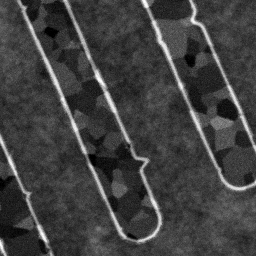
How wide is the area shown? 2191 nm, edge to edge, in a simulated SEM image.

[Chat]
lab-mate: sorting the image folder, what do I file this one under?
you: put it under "one or a few lines or trenches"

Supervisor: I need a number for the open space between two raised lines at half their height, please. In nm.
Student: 616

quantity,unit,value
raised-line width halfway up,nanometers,368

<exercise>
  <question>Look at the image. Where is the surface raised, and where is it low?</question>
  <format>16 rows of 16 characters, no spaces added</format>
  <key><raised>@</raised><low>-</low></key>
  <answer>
-@@@-----@@@----
--@@@-----@@----
--@@@-----@@@---
---@@@-----@@---
---@@@-----@@@--
----@@-----@@@--
----@@@-----@@@-
----@@@-----@@@-
-----@@@-----@@@
-----@@@-----@@@
@-----@@@-----@@
@-----@@@-----@@
@@-----@@@------
@@-----@@@------
@@@-----@@------
@@@-------------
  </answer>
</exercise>